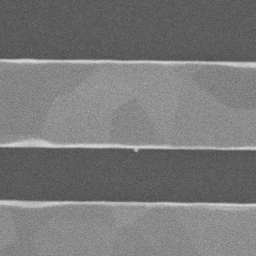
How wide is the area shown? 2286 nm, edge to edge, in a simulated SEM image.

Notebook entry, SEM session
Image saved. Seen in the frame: wiring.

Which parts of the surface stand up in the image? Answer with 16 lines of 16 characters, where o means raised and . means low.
................
................
................
................
oooooooooooooooo
oooooooooooooooo
oooooooooooooooo
oooooooooooooooo
oooooooooooooooo
................
................
................
................
oooooooooooooooo
ooooooo.oooooooo
oooooooooooooooo